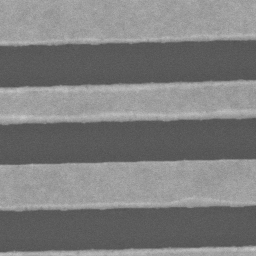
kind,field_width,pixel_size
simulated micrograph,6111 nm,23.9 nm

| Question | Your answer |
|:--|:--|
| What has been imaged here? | lines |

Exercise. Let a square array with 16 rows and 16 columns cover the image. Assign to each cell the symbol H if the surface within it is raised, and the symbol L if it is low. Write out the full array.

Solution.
HHHHHHHHHHHHHHHH
HHHHHHHHHHHHHHHH
HHHHHHHHHHLLLLLL
LLLLLLLLLLLLLLLL
LLLLLLLLLLLLLLLL
LLHHHHHHHHHHHHHH
HHHHHHHHHHHHHHHH
HHHHHLLLLLLLLLLL
LLLLLLLLLLLLLLLL
LLLLLLLLLLLLLLLL
HHHHHHHHHHHHHHHH
HHHHHHHHHHHHHHHH
HHHHHHHHHHHHHHHH
LLLLLLLLLLLLLLLL
LLLLLLLLLLLLLLLL
LLLLLLLLLLLLLHHH